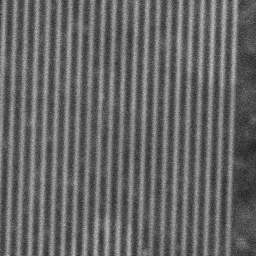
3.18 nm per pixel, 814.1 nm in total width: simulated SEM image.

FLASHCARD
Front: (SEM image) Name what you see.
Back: parallel lines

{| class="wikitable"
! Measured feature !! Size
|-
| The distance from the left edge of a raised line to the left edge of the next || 0.035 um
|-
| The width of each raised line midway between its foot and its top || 9.1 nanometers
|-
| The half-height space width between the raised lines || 0.0242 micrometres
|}